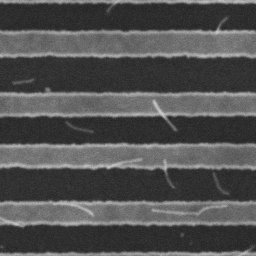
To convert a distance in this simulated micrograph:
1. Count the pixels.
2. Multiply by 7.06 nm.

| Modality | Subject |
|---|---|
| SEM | lines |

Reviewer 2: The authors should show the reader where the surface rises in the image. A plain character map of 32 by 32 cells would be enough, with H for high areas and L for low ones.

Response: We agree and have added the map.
LLLLLLLLLLLLLLLLLLLLLLLLLLLLLLLL
LLLLLLLLLLLLLLLLLLLLLLLLLLLLLLLL
LLLLLLLLLLLLLLLLLLLLLLLLLLLLLLLL
LLLLLLLLLLLLLLLLLLLLLLLLLLLLLLLL
HHHHHHHHHHHHHHHHHHHHHHHHHHHHHHHH
HHHHHHHHHHHHHHHHHHHHHHHHHHHHHHHH
HHHHHHHHHHHHHHHHHHHHHHHHHHHHHHHH
LLLLLLLLLLLLLLLLLLLLLLLLLLLLLLLL
LLLLLLLLLLLLLLLLLLLLLLLLLLLLLLLL
LLLLLLLLLLLLLLLLLLLLLLLLLLLLLLLL
LLLLLLLLLLLLLLLLLLLLLLLLLLLLLLLL
LLLLLLLLLLLLLLLLLLLLLLLLLLLLLLLL
HHHHHHHHHHHHHHHHHHHHHHHHHHHHHHHH
HHHHHHHHHHHHHHHHHHHHHHHHHHHHHHHH
HHHHHLHHHHHHHHHHHHHHHHLHHHHHHHLL
LLLLLLLLLLLLLLLLLLLLLLLLLLLLLLLL
LLLLLLLLLLLLLLLLLLLLLLLLLLLLLLLL
LLLLLLLLLLLLLLLLLLLLLLLLLLLLLLLL
HHHHHHHHHHHHHHHHHHHHHHHHHHHHHHHH
HHHHHHHHHHHHHHHHHHHHHHHHHHHHHHHH
HHHHHHHHHHHHHHHHHHHHHHHHHHHHHHHH
LLLLLLLLLLLLLLLLLLLLLLLLLLLLLLLL
LLLLLLLLLLLLLLLLLLLLLLLLLLLLLLLL
LLLLLLLLLLLLLLLLLLLLLLLLLLLLLLLL
LLLLLLLLLLLLLLLLLLLLLLLLLLLLLLLL
HHHHHHHHHHHHHHHHHHHHHHHHHHHHHHHH
HHHHHHHHHHHHHHHHHHHHHHHHHHHHHHHH
HHHHHHHHHHHHHHHHHHHHHHHHHHHHHHHH
LLLLLLLLLLLLLLLLLLLLLLLLLLLLLLLL
LLLLLLLLLLLLLLLLLLLLLLLLLLLLLLLL
LLLLLLLLLLLLLLLLLLLLLLLLLLLLLLLL
LLLLLLLLLLLLLLLLLLLLLLLLLLLLLLHL